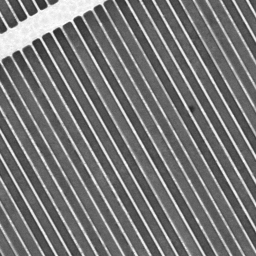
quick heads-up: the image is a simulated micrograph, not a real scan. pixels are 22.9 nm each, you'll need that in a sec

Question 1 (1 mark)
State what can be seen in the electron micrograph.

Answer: parallel lines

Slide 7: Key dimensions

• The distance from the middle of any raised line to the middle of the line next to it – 268 nanometers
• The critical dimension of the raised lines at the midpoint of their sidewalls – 40 nm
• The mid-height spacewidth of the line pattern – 220 nm